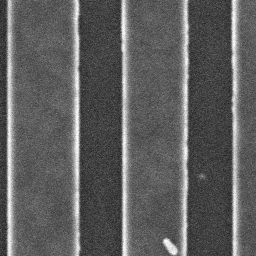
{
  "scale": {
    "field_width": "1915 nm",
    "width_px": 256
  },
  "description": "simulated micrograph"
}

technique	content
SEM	lines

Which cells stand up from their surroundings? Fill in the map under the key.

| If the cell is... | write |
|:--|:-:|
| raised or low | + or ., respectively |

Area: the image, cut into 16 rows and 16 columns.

.++++...++++...+
.++++...++++...+
.++++...++++...+
.++++...++++...+
.++++...++++...+
.++++...++++...+
.++++...++++...+
.++++...++++...+
.++++...++++...+
.++++...++++...+
.++++...++++...+
.++++...++++...+
.++++...++++...+
.++++...++++...+
.++++...++++...+
.++++...++++...+